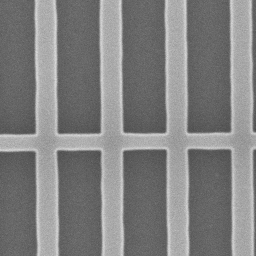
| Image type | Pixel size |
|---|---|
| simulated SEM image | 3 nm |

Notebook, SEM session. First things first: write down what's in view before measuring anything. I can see groups of lines, slits or small figures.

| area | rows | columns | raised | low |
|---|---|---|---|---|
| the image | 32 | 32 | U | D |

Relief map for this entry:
DDDDDUUDDDDDDUUDDDDDDUUDDDDDDUUD
DDDDUUUDDDDDDUUDDDDDDUUDDDDDDUUD
DDDDUUUDDDDDDUUDDDDDDUUDDDDDDUUD
DDDDDUUDDDDDDUUDDDDDDUUDDDDDDUUD
DDDDDUUDDDDDDUUDDDDDDUUDDDDDDUUD
DDDDDUUDDDDDDUUDDDDDDUUDDDDDDUUD
DDDDDUUDDDDDDUUDDDDDDUUDDDDDDUUD
DDDDDUUDDDDDDUUDDDDDDUUDDDDDDUUD
DDDDDUUDDDDDDUUDDDDDDUUDDDDDDUUD
DDDDDUUDDDDDDUUDDDDDDUUDDDDDDUUD
DDDDDUUDDDDDDUUDDDDDDUUDDDDDDUUD
DDDDDUUDDDDDDUUDDDDDDUUDDDDDDUUU
DDDDDUUDDDDDDUUDDDDDDUUDDDDDDUUU
DDDDDUUDDDDDDUUDDDDDDUUDDDDDDUUU
DDDDDUUDDDDDDUUDDDDDDUUDDDDDDUUD
DDDDDUUDDDDDDUUDDDDDDUUDDDDDDUUD
DDDDUUUDDDDDUUUUDDDDDUUDDDDDDUUU
UUUUUUUUUUUUUUUUUUUUUUUUUUUUUUUU
UUUUUUUUUUUUUUUUUUDDUUUUDDDDUUUU
DDDDDUUDDDDDDUUDDDDDDUUDDDDDDUUU
DDDDDUUDDDDDDUUDDDDDDUUDDDDDDUUU
DDDDDUUDDDDDDUUDDDDDDUUDDDDDDUUU
DDDDDUUDDDDDDUUDDDDDDUUDDDDDDUUU
DDDDDUUDDDDDDUUDDDDDDUUDDDDDDUUU
DDDDDUUDDDDDDUUDDDDDDUUDDDDDDUUU
DDDDDUUDDDDDDUUDDDDDDUUDDDDDDUUU
DDDDDUUDDDDDDUUDDDDDDUUDDDDDDUUU
DDDDDUUDDDDDDUUDDDDDDUUDDDDDDUUU
DDDDDUUDDDDDDUUDDDDDDUUDDDDDDUUU
DDDDDUUDDDDDDUUDDDDDDUUDDDDDDUUU
DDDDDUUDDDDDDUUDDDDDDUUDDDDDDUUU
DDDDDUUDDDDDDUUDDDDDDUUDDDDDDUUU